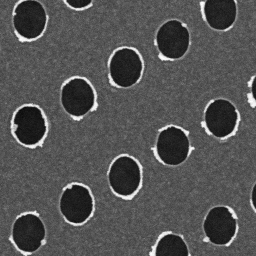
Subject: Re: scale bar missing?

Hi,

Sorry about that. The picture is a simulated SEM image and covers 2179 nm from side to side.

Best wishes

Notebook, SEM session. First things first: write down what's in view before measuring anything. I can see a regular array of holes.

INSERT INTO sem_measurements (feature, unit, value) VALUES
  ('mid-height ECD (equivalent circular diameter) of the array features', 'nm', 297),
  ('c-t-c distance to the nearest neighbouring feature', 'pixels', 55.7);